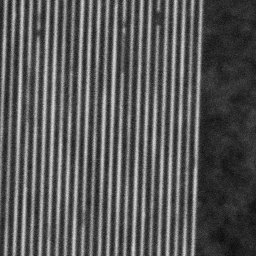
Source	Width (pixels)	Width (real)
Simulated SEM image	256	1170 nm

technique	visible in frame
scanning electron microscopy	parallel lines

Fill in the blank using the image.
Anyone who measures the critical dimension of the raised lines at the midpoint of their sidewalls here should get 6.8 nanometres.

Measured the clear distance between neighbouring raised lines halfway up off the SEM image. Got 0.0314 um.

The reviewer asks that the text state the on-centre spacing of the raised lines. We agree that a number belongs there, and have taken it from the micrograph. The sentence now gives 38.8 nm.